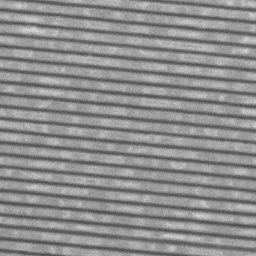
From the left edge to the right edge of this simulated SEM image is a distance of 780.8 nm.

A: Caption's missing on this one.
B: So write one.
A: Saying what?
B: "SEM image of parallel lines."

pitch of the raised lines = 12 pixels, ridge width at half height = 0.0266 um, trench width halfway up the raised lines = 11.8 nm